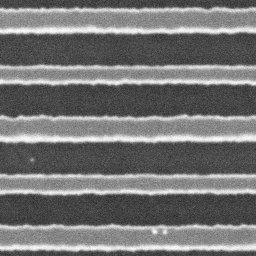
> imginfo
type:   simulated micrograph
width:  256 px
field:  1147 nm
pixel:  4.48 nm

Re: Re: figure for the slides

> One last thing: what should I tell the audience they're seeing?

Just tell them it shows lines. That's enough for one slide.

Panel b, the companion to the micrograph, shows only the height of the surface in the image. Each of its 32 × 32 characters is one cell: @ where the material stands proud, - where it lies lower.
--------------------------------
@@@@@@@@@@@@@@@@@@@@@@@@@@@@@@@@
@@@@@@@@@@@@@@@@@@@@@@@@@@@@@@@@
@@@@@@@@@@@@@@@@@@@@@@@@@@@@@@@@
--------------------------------
--------------------------------
--------------------------------
--------------------------------
@@@@@@@@@@@@@@@@@@@@@@@@@@@@@@@@
@@@@@@@@@@@@@@@@@@@@@@@@@@@@@@@@
---@--@@---@-@@--@-------@@-@@-@
--------------------------------
--------------------------------
--------------------------------
--------------------------------
@@@@@@@@@@@@@@@@@@@@@@@@@@@@@@@@
@@@@@@@@@@@@@@@@@@@@@@@@@@@@@@@@
@@@@@@@@@@@@@@@@@@@@@@@@@@@@@@@@
--------------------------------
--------------------------------
--------------------------------
--------------------------------
@@@@@@@@@@@@@@@@@@@@@@@@@@@@@@@@
@@@@@@@@@@@@@@@@@@@@@@@@@@@@@@@@
--------------------------------
--------------------------------
--------------------------------
--------------------------------
@@@@@@@@@@@@@@@@@@@@@@@@@@@@@@@@
@@@@@@@@@@@@@@@@@@@@@@@@@@@@@@@@
@@@@@@@@@@@@@@@@@@@@@@@@@@@@@@@@
--------------------------------